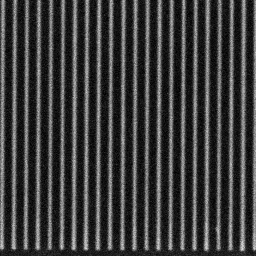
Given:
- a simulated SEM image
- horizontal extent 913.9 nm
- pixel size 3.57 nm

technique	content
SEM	parallel lines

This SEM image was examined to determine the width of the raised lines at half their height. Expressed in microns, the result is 0.0094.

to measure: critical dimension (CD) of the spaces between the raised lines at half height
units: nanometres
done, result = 33.9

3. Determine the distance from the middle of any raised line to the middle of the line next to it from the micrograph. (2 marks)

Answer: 0.0429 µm